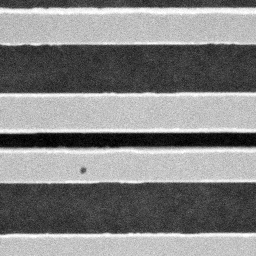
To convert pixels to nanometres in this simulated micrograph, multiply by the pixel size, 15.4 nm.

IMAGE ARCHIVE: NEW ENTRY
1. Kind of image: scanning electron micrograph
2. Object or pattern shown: lines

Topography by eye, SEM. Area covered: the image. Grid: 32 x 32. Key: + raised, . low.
................................
++++++++++++++++++++++++++++++++
++++++++++++++++++++++++++++++++
++++++++++++++++++++++++++++++++
++++++++++++++++++++++++++++++++
++++++++........................
................................
................................
................................
................................
................................
................................
++++++++++++++++++++++++++++++++
++++++++++++++++++++++++++++++++
++++++++++++++++++++++++++++++++
++++++++++++++++++++++++++++++++
++++++++++++++++++++++++++++++++
................................
................................
++++++++++++++++++++++++++++++++
++++++++++++++++++++++++++++++++
++++++++++++++++++++++++++++++++
++++++++++++++++++++++++++++++++
................................
................................
................................
................................
................................
................................
++++++++++++++++++++++++++++++++
++++++++++++++++++++++++++++++++
++++++++++++++++++++++++++++++++